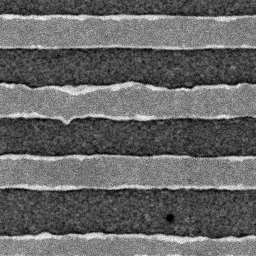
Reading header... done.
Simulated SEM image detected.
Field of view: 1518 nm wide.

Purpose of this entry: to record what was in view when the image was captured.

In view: one or a few lines or trenches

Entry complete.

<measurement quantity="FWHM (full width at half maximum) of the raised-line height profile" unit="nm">187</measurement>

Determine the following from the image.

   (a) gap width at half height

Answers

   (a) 238 nm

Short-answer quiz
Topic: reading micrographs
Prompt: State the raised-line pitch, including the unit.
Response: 416 nm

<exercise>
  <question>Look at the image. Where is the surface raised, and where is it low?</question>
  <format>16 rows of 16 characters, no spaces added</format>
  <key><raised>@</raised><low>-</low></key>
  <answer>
----------------
@@@@@@@@@@@@@@@@
@@@@@@@@@@@@@@@@
----------------
----------------
@@@@-@@@@@--@@@@
@@@@@@@@@@@@@@@@
----------------
----------------
----------------
@@@@@@@@@@@@@@@@
@@@@@@@@@@@@@@@@
----------------
----------------
----------------
@@@@@@@@@@@@@@@@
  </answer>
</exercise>